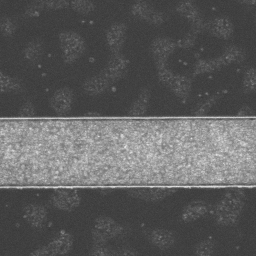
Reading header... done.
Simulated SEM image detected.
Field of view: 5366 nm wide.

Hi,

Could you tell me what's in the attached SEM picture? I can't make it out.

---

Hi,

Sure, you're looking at one or a few lines or trenches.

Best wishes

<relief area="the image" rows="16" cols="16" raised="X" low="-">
XXXXXXXXXXXXXXXX
XXXXXXXXXXXXXXXX
XXXXXXXXXXXXXXXX
XXXXXXXXXXXXXXXX
XXXXXXXXXXXXXXXX
XXXXXXXXXXXXXXXX
XXXXXXXXXXXXXXXX
----------------
----------------
----------------
----------------
----------------
XXXXXXXXXXXXXXXX
XXXXXXXXXXXXXXXX
XXXXXXXXXXXXXXXX
XXXXXXXXXXXXXXXX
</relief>